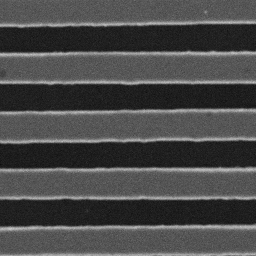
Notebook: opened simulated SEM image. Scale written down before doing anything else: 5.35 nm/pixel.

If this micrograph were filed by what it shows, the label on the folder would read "lines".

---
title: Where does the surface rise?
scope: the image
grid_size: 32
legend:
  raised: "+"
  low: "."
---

++++++++++++++++++++++++++++++++
++++++++++++++++++++++++++++++++
++++++++++++++++++++++++++++++++
................................
................................
................................
................................
++++++++++++++++++++++++++++++++
++++++++++++++++++++++++++++++++
++++++++++++++++++++++++++++++++
......+.+......+++......+.......
................................
................................
................................
++++++++++++++++++++++++++++++++
++++++++++++++++++++++++++++++++
++++++++++++++++++++++++++++++++
++++++++++++++++++++++++++++++++
................................
................................
................................
++++++++++++++++++++++++++++++++
++++++++++++++++++++++++++++++++
++++++++++++++++++++++++++++++++
++++++++++++++++++++++++++++++++
................................
................................
................................
++++++++++++++++++++++++++++++++
++++++++++++++++++++++++++++++++
++++++++++++++++++++++++++++++++
++++++++++++++++++++++++++++++++